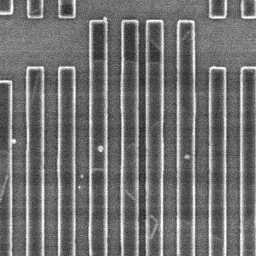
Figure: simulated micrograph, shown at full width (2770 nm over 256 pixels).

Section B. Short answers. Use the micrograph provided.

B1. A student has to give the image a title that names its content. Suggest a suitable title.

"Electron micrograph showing wiring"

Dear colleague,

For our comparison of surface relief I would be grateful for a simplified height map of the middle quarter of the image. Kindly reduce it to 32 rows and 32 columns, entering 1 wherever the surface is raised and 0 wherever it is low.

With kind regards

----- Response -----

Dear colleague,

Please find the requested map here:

00000001111000011100011110001111
11100001111000011100011110001111
11100001111000111100011110001111
11100001111000111100011110001111
11100001111000111100011110001111
11100001111000111100011110001111
11100001111000111100011110001111
11100001111000111100011110001111
11100001111000111100011110001111
11100001111000111100011110001111
11100001111000111100011110001111
11100001111000111100011110001111
11100001111000111100011110001111
11100001111000011100011110001111
11100001111000011100011110001111
11100001111000011100011100001111
11100001111000011100011100001111
11100001111000011100011100001111
11100001111000011100011110001111
11100001111000011100011110001111
11100001111000011100011110001111
11100001111000011100011110001111
11100001111000011100011110001111
11100001111000011100011110001111
11100001111000011100011110001111
11100001111000111100011110001111
11100001111000111100011110001111
11100001111000111100011110001111
11100001111000111100011100001111
11100001111000111100011100001111
11100001111000111100011100001111
11100001111000111100011100001111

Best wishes